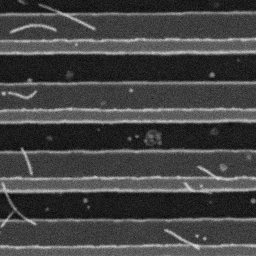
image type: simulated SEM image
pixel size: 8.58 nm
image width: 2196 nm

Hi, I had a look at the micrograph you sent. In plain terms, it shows lines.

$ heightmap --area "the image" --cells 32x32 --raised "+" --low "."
................................
................................
++++++++++++++++++++++++++++++++
++++++++++++++++++++++++++++++++
++++++++++++++++++++++++++++++++
++++++++++++++++++++++++++++++++
+++++++++++++++++++++++++++++...
................................
................................
................................
...+++++.+++++++++++++++++++++++
++++++++++++++++++++++++++++++++
++++++++++++++++++++++++++++++++
++++++++++++++++++++++++++++++++
++++++++++++++++++++++++++++++++
................................
................................
................................
................................
++++++++++++++++++++++++++++++++
++++++++++++++++++++++++++++++++
++++++++++++++++++++++++++++++++
++++++++++++++++++++++++++++++++
++++++++++++++++++++++++++++++++
................................
................................
................................
...+.....................+++++.+
++++++++++++++++++++++++++++++++
++++++++++++++++++++++++++++++++
++++++++++++++++++++++++++++++++
++++++++++++++++++++++++++++++++